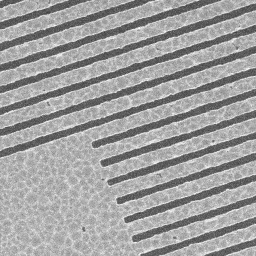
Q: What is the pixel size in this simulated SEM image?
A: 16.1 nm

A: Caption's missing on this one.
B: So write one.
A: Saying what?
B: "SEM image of parallel lines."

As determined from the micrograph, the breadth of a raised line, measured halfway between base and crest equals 204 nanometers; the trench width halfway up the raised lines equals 0.12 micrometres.